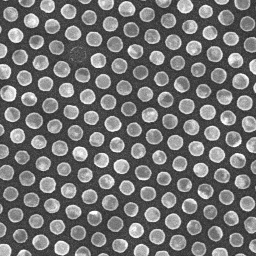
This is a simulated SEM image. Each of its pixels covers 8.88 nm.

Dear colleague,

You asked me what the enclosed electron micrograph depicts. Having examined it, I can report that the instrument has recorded a regular array of raised bodies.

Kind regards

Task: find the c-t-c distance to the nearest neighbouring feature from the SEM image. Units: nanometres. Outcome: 190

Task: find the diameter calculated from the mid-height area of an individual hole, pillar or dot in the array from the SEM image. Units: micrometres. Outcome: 0.131